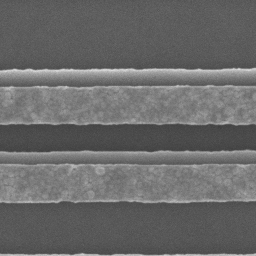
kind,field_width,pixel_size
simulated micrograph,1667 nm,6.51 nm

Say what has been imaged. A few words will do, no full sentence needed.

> lines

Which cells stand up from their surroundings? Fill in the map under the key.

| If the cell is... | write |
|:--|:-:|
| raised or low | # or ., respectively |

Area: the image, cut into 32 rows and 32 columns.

................................
................................
................................
................................
................................
................................
................................
................................
................................
################################
################################
################################
################################
################################
################################
#..#..##.##.###....##..###.#.##.
................................
................................
................................
################################
################################
################################
################################
################################
################################
................................
................................
................................
................................
................................
................................
................................